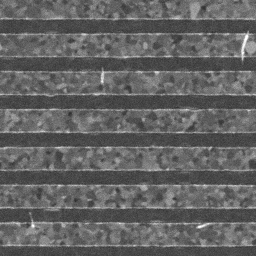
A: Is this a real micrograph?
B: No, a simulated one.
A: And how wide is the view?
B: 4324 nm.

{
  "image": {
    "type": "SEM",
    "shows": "parallel lines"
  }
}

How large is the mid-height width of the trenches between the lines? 253 nanometers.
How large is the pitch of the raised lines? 638 nm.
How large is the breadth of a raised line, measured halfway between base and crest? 385 nanometres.